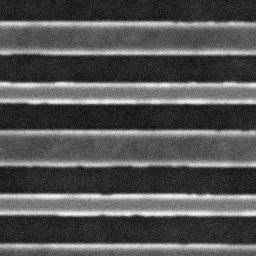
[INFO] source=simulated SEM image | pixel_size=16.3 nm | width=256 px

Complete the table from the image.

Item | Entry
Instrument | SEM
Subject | lines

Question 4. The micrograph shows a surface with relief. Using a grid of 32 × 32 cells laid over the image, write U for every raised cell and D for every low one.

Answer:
DDDDDDDDDDDDDDDDDDDDDDDDDDDDDDDD
DDDDDDDDDDDDDDDDDDDDDDDDDDDDDDDD
DDDDDDDDDDDDDDDDDDDDDDDDDDDDDDDD
UUUUUUUUUUUUUUUUUUUUUUUUUUUUUUUU
UUUUUUUUUUUUUUUUUUUUUUUUUUUUUUUU
UUUUUUUUUUUUUUUUUUUUUUUUUUUUUUUU
UUUUUUUUUUUUUUUUUUUUUUUUUUUUUUUU
DDDDDDDDDDDDDDDDDDDDDDDDDDDDDDDD
DDDDDDDDDDDDDDDDDDDDDDDDDDDDDDDD
DDDDDDDDDDDDDDDDDDDDDDDDDDDDDDDD
UUDDDDUUUUDDDDDDDDDDDDDUUDDDUUDD
UUUUUUUUUUUUUUUUUUUUUUUUUUUUUUUU
UUUUUUUUUUUUUUUUUUUUUUUUUUUUUUUU
DDDDDDDDDDDDDDDDDDDDDDDDDDDDDDDD
DDDDDDDDDDDDDDDDDDDDDDDDDDDDDDDD
DDDDDDDDDDDDDDDDDDDDDDDDDDDDDDDD
UUUUUUUUUUUUUUUUUUDUUUUUUUUUUUDU
UUUUUUUUUUUUUUUUUUUUUUUUUUUUUUUU
UUUUUUUUUUUUUUUUUUUUUUUUUUUUUUUU
UUUUUUUUUUUUUUUUUUUUUUUUUUUUUUUU
UUUUUUUUUUUUUUUUUUUUUUUUUUUUUUUU
DDDDDDDDDDDDDDDDDDDDDDDDDDDDDDDD
DDDDDDDDDDDDDDDDDDDDDDDDDDDDDDDD
DDDDDDDDDDDDDDDDDDDDDDDDDDDDDDDD
UUUUUUUUUUUUUDUUUUUUUUUUUUUDDDDD
UUUUUUUUUUUUUUUUUUUUUUUUUUUUUUUU
UUUUUUUUUUUUUUUUUUUUUUUUUUUUUUUU
DDDDDDDDDDDDDDDDDDDDDDDDDDDDDDDD
DDDDDDDDDDDDDDDDDDDDDDDDDDDDDDDD
DDDDDDDDDDDDDDDDDDDDDDDDDDDDDDDD
DDDDDDDDDDDDDDDDDDDDDDDDDDDDDDDD
UUUUUUUUUUUUUUUUUUUUUUUUUUUUUUUU